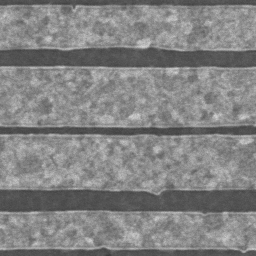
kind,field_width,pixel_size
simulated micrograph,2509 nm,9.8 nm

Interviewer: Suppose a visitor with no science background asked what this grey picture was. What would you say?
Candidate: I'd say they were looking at one or a few lines or trenches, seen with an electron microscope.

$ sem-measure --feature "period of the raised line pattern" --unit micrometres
0.663